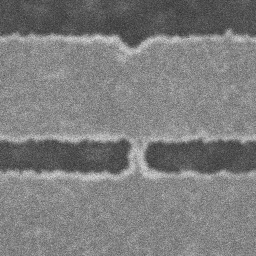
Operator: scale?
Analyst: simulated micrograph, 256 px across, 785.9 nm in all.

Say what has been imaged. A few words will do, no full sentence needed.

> one or a few lines or trenches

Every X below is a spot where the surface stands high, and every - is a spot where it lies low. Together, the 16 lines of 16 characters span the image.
----------------
----------------
XXXXXXX--XXXXXXX
XXXXXXXXXXXXXXXX
XXXXXXXXXXXXXXXX
XXXXXXXXXXXXXXXX
XXXXXXXXXXXXXXXX
XXXXXXXXXXXXXXXX
XXXXXXXXXXXXXXXX
--------X-------
--------X-------
XXXXXXXXXXXXXXXX
XXXXXXXXXXXXXXXX
XXXXXXXXXXXXXXXX
XXXXXXXXXXXXXXXX
XXXXXXXXXXXXXXXX